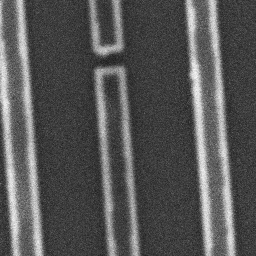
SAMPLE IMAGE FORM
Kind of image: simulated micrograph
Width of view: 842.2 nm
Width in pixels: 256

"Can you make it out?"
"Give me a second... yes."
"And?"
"one or a few lines or trenches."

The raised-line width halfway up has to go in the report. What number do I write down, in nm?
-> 82.8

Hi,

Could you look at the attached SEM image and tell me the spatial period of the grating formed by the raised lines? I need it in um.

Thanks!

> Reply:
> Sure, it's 0.316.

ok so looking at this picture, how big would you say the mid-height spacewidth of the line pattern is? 0.233 um